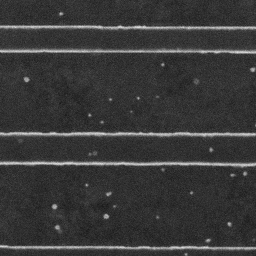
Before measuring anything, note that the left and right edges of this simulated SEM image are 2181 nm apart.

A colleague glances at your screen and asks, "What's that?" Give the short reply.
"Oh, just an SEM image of lines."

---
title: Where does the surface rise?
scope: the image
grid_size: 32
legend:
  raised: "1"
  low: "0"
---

00000000000000000000000000000000
00000000000000000000000000000000
00000000000000000000000000000000
11111111111111111111111111111111
11111111111111111111111111111111
11111111111111111111111111111111
00000000000000000000000000000111
00000000000000000000000000000000
00000000000000000000000000000000
00000000000000000000000000000000
00000000000000000000000000000000
00000000000000000000000000000000
00000000000000000000000000000000
00000000000000000000000000000000
00000000000000000000000000000000
00000000000000000000000000000000
00000000000000000000000000000000
11111111111111111111111111111111
11111111111111111111111111111111
11111111111111111111111111111111
00000000000000000100000000011111
00000000000000000000000000000000
00000000000000000000000000000000
00000000000000000000000000000000
00000000000000000000000000000000
00000000000000000000000000000000
00000000000000000000000000000000
00000000000000000000000000000000
00000000000000000000000000000000
00000000000000000000000000000000
00000000000000000000000000000000
11111111111111111111111111111111